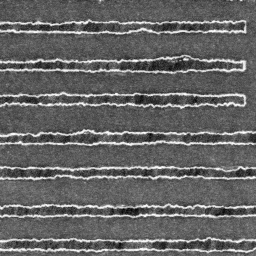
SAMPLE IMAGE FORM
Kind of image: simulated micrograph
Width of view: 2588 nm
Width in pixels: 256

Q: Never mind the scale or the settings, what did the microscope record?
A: parallel lines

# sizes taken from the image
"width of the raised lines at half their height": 10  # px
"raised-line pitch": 367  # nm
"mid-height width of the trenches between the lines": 258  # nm